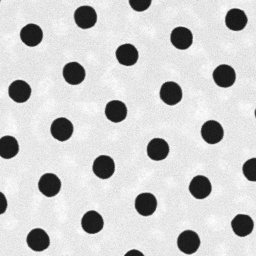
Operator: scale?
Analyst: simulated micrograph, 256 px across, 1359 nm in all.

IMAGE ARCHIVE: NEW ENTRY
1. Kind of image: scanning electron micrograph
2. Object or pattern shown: a regular array of holes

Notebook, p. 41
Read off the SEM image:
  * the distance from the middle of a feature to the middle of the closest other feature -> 299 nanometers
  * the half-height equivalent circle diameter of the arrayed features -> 23.2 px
